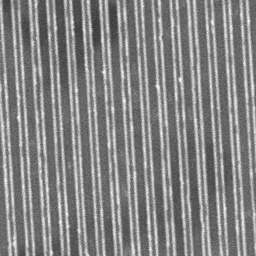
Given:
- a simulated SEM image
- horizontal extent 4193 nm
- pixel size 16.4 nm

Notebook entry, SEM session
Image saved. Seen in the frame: parallel lines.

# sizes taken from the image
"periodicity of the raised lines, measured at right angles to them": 288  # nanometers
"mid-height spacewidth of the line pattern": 164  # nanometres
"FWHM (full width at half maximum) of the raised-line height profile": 118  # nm